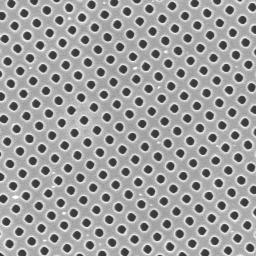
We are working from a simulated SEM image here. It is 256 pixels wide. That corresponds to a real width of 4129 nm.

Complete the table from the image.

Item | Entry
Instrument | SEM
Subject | a regular array of holes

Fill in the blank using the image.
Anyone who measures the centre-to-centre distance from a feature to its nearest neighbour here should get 254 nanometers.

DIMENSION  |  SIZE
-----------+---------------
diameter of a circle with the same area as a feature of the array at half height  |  141 nm